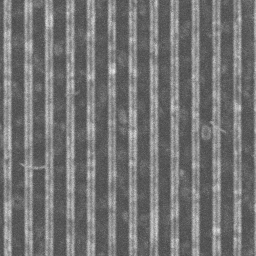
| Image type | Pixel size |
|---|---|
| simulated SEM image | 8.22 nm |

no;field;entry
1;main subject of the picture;parallel lines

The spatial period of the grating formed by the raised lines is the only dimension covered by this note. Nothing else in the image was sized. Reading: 20.9 px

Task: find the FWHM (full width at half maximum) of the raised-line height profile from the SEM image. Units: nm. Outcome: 47.3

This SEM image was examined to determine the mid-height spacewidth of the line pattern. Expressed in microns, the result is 0.128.